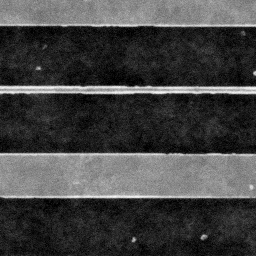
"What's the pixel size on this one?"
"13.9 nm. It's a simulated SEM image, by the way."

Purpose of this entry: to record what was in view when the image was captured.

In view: lines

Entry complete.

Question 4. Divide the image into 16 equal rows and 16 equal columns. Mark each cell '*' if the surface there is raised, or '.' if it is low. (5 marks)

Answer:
****************
****************
................
................
................
................
................
................
................
................
****************
****************
................
................
................
................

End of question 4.